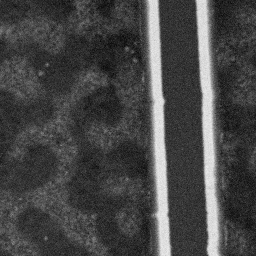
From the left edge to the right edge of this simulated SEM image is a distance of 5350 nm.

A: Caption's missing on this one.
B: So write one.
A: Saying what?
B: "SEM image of one or a few lines or trenches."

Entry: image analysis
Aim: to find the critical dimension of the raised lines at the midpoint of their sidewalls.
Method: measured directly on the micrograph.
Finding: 1050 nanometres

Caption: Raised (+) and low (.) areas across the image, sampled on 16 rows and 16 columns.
..........+++...
..........+++...
..........+++...
..........+++...
..........+++...
..........+++...
..........+++...
..........+++...
..........+++...
..........+++...
..........+++...
..........+++...
..........+++...
..........+++...
..........+++...
..........+++...